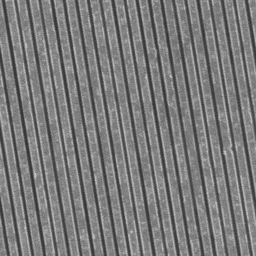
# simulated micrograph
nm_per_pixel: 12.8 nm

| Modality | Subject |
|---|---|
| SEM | parallel lines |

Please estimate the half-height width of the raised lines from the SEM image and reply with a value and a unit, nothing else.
108 nm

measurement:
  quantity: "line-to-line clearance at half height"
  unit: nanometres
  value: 48.8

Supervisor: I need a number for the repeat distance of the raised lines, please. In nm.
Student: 153